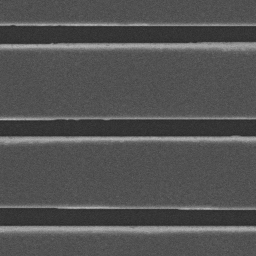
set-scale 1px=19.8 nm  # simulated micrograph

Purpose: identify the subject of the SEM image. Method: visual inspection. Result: lines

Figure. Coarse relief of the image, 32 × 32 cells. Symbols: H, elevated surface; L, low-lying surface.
HHHHHHHHHHHHHHHHHHHHHHHHHHHHHHHH
HHHHHHHHHHHHHHHHHHHHHHHHHHHHHHHH
HHHHHHHHHHHHHHHHHHHHHHHHHHHHHHHH
LLLLLLLLLLLLLLLLLLLLLLLLLLLLLLLL
LLLLLLLLLLLLLLLLLLLLLLLLLLLLLLLL
LLLLLLLLLLLLLLLLLLLLLLLLLHHLLHHH
HHHHHHHHHHHHHHHHHHHHHHHHHHHHHHHH
HHHHHHHHHHHHHHHHHHHHHHHHHHHHHHHH
HHHHHHHHHHHHHHHHHHHHHHHHHHHHHHHH
HHHHHHHHHHHHHHHHHHHHHHHHHHHHHHHH
HHHHHHHHHHHHHHHHHHHHHHHHHHHHHHHH
HHHHHHHHHHHHHHHHHHHHHHHHHHHHHHHH
HHHHHHHHHHHHHHHHHHHHHHHHHHHHHHHH
HHHHHHHHHHHHHHHHHHHHHHHHHHHHHHHH
HHHHHHHHHHHHHHHHHHHHHHHHHHHHHHHH
LLLLLLLLLLLLLLLLLLLLLLLLLLLLLLLL
LLLLLLLLLLLLLLLLLLLLLLLLLLLLLLLL
HHHHHHHHHHHHHHHHHHHHHHHHHHHHHHHH
HHHHHHHHHHHHHHHHHHHHHHHHHHHHHHHH
HHHHHHHHHHHHHHHHHHHHHHHHHHHHHHHH
HHHHHHHHHHHHHHHHHHHHHHHHHHHHHHHH
HHHHHHHHHHHHHHHHHHHHHHHHHHHHHHHH
HHHHHHHHHHHHHHHHHHHHHHHHHHHHHHHH
HHHHHHHHHHHHHHHHHHHHHHHHHHHHHHHH
HHHHHHHHHHHHHHHHHHHHHHHHHHHHHHHH
HHHHHHHHHHHHHHHHHHHHHHHHHHHHHHHH
LLLLLLLLLLLLLLLLLLLLLLLLLLLLLLLL
LLLLLLLLLLLLLLLLLLLLLLLLLLLLLLLL
HHHHHHHHHHHHHHHHHHHHHHHHHHHHHHHH
HHHHHHHHHHHHHHHHHHHHHHHHHHHHHHHH
HHHHHHHHHHHHHHHHHHHHHHHHHHHHHHHH
HHHHHHHHHHHHHHHHHHHHHHHHHHHHHHHH